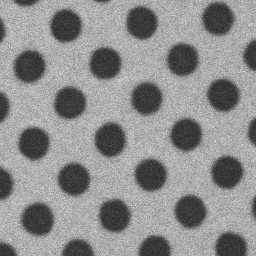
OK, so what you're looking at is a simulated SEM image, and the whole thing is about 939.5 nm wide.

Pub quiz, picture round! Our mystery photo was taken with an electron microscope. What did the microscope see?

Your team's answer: a regular array of holes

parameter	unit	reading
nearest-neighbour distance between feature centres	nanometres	198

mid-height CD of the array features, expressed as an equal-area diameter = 118 nm